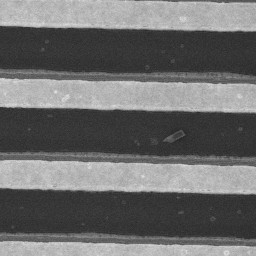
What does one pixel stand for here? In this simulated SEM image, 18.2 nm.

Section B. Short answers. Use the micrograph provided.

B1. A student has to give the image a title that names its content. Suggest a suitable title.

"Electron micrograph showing lines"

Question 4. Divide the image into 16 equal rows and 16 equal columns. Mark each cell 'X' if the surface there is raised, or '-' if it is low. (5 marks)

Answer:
XXXXXXXXXXXXXXXX
XXXXXXXXXXXXXXXX
----------------
----------------
X---------------
XXXXXXXXXXXXXXXX
XXXXXXXXXXXXXXXX
----------------
----------------
----------------
XXXXXXXXXXXXXXXX
XXXXXXXXXXXXXXXX
----------------
----------------
----------------
XXXXXXXXXXXXXXXX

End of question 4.